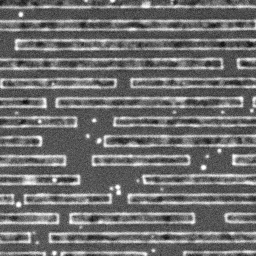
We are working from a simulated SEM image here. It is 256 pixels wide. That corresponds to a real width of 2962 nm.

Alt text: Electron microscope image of wiring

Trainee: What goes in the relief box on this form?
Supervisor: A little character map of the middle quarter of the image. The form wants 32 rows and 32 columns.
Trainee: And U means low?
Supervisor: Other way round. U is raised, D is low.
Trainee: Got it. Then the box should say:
UUUUUUUUUUUUUUUUUUUUUUUUUUUUUUUU
DDDDDDDDDDDDDDDDDDDDDDDDDDDDDDDD
DDDDDDDDDDDDDDDDDDDDDDDDDDDDDDDD
DDDDDDDDDDDDDDDDDDDDDDDDDDDDDDDD
UUUUUUUUUUUUUDDDDUUUUUUUUUUUUUUU
UUUUUUUUUUUUUDDDDUUUUUUUUUUUUUUU
DDDDDDDDDDDDDDDDDDDDDDDDDDDDDDDD
DDDDDDDDDDDDDDDDDDDDDDDDDDDDDDDD
UUDDDDDDDDDDDUUUUDUUUUUUDUUUUUUU
UUUUUUUUUUUUUUUUUUUUUUUUUUUUUUUU
UUUUUUUUUUUUUUUUUUUUUUUUUUUUUUUU
DDDDDDDDDDDDDDDDDDDDDDDDDDDDDDDD
DDDDDDDDDDDDDDDDDDDDDDDDDDDDDDDD
UUUDDDDDDDDDDUUUUUUUUUUUUUUUUUUU
UUUDDDDDDDDDDUUUUUUUUUUUUUUUUUUU
UUUDDDDDDDDDDDDDDDDDDDDDDDDDDDDD
DDDDDDDDDDDDDDDDDDDDDDDDDDDDDDDD
DDDDDDDDDDDDDDDDDDDDDDDDDDDDDDDD
DDDDDDDDDDUUUUUUUUUUUUUUUUUUUUUU
DDDDDDDDDDUUUUUUUUUUUUUUUUUUUUUU
DDDDDDDDDDDDDDDDDDDDDDDDDDDDDDDD
DDDDDDDDDDDDDDDDDDDDDDDDDDDDDDDD
DDDDDDDDDDDDDDDDDDDDDDDDDDDDDDDD
DDDDDDDUUUUUUUUUUUUUUUUUUUUUUUUD
DDDDDDDUUUUUUUUUUUUUUUUUUUUUUUUD
DDDDDDDDDDDDDDDDDDDDDDDDDDDDDDDD
DDDDDDDDDDDDDDDDDDDDDDDDDDDDDDDD
DDDDDDDDDDDDDDDDDDDDDDDDDDDDDDDD
UUUUDDDDDDDDDDDDDDDDUUUUUUUUUUUU
UUUUDDDDDDDDDDDDDDDDUUUUUUUUUUUU
DDDDDDDDDDDDDDDDDDDDDDDDDDDDDDDD
DDDDDDDDDDDDDDDDDDDDDDDDDDDDDDDD